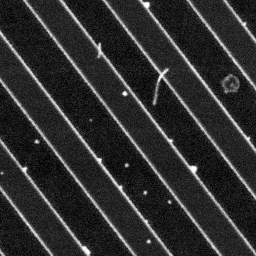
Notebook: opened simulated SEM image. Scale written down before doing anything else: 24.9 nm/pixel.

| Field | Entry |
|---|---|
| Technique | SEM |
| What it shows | lines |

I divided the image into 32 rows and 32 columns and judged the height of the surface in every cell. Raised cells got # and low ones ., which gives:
...#####.....#####......#####...
....#####.....#####......####...
.....#####.....#####.....#####..
......####......####......#####.
......#####.....#####......#####
#......#####.....#####......####
##......#####.....#####.....####
###......####......####......###
####.....#####.....#####......##
####......#####.....#####......#
#####......#####.....#####.....#
.#####......#####.....####......
..#####......####.....#####.....
...####......#####.....#####....
...#####......#####.....#####...
....#####......#####.....#####..
.....#####......####......####..
......####......#####.....#####.
#.....#####......#####.....#####
##.....#####......#####.....####
##......#####......####......###
###......####......#####.....###
####......####......#####.....##
#####.....#####......#####.....#
.####......#####......#####.....
.#####......#####......####.....
..#####......####......#####....
...#####.....#####......#####...
....####......#####......#####..
.....####......#####......####..
.....#####......####......#####.
......#####.....#####......#####